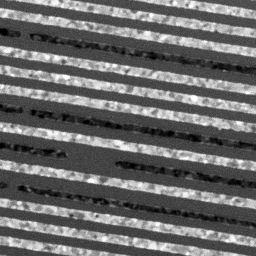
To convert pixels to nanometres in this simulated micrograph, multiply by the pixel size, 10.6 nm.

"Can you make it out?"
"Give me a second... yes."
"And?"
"parallel lines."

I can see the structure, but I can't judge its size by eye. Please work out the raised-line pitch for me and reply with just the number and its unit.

198 nanometres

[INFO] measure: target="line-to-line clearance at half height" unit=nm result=111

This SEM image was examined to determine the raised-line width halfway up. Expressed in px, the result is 8.02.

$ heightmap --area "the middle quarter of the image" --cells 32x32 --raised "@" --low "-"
---@@@@@@@@@@@@-----------------
---------@@@@@@@@@@@@-----------
---------------@@@@@@@@@@@@@----
@@@@------------------@@@@@@@@@@
@@@@@@@@@@------------------@@@@
----@@@@@@@@@@@@@---------------
----------@@@@@@@@@@@@@---------
-----------------@@@@@@@@@@@@---
@@@@@@-----------------@@@@@@@@@
@@@@@@@@@@@-------------------@@
------@@@@@@@@@@@@--------------
------------@@@@@@@@@@@@--------
@------------------@@@@@@@@@@@@-
@@@@@@@-----------------@@@@@@@@
@@@@@@@@@@@@@------------------@
-------@@@@@@@@@@@@@------------
--------------@@@@@@@@@@@@------
@@@-----------------@@@@@@@@@@@@
@@@@@@@@@-----------------@@@@@@
--@@@@@@@@@@@@@-----------------
---------@@@@@@@@@@@@@----------
----------------@@@@@@@@@@@-----
@--------------------@@@@@@@@@@@
----------------------------@@@@
-------------@@@@---------------
-------------@@@@@@@@@@@--------
-----------------@@@@@@@@@@@@---
@@@@@-------------------@@@@@@@@
@@@@@@@@@@@@------------------@@
------@@@@@@@@@@@@--------------
-------------@@@@@@@@@@@@-------
-------------------@@@@@@@@@@@@@